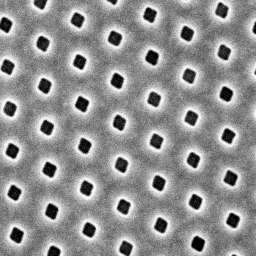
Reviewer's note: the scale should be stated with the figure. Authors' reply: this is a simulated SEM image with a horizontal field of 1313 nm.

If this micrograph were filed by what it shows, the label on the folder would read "a regular array of holes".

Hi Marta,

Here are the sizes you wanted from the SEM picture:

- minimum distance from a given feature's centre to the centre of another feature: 213 nm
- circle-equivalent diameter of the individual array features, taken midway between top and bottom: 78.3 nanometres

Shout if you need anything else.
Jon